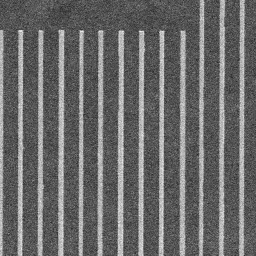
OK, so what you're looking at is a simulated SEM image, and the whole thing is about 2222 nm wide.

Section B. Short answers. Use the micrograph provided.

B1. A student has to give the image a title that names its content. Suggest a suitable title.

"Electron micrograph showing parallel lines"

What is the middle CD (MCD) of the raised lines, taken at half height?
38 nm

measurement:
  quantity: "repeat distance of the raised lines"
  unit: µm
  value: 0.175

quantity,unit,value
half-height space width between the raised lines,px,15.7